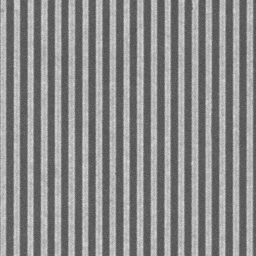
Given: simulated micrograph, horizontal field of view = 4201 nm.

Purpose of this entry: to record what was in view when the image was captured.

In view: parallel lines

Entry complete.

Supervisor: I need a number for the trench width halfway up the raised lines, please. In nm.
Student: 133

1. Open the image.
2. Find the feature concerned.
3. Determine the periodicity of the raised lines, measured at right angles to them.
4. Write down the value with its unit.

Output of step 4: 0.225 µm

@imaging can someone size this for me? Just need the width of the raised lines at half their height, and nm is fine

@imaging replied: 86.1